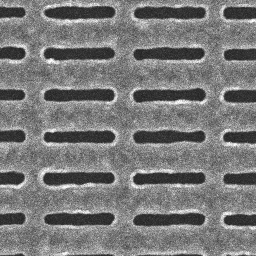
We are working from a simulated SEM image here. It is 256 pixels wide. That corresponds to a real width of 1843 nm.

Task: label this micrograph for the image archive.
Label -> a regular array of holes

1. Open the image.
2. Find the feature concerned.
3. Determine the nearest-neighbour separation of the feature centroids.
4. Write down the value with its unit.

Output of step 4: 40.8 px